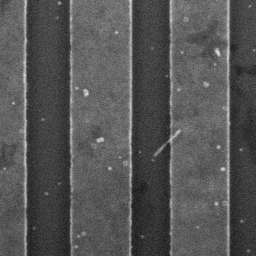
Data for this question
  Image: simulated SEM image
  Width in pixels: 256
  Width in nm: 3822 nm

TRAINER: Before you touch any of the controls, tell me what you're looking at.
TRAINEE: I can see lines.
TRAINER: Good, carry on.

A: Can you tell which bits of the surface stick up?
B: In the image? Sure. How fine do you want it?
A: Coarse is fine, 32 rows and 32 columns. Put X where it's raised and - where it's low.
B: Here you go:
XXX------XXXXXXX-----XXXXXXXX---
XXX------XXXXXXX-----XXXXXXXX---
XXX------XXXXXXX-----XXXXXXXX---
XXX------XXXXXXX-----XXXXXXXX---
XXX------XXXXXXX-----XXXXXXXX---
XXX------XXXXXXX-----XXXXXXXX---
XXX------XXXXXXX-----XXXXXXXX---
XXX------XXXXXXX-----XXXXXXXX---
XXX------XXXXXXX-----XXXXXXXX---
XXX------XXXXXXX-----XXXXXXXX---
XXX------XXXXXXX-----XXXXXXXX---
XXX------XXXXXXX-----XXXXXXXX---
XXX------XXXXXXX-----XXXXXXXX---
XXX------XXXXXXX-----XXXXXXXX---
XXX------XXXXXXX-----XXXXXXXX---
XXX------XXXXXXX-----XXXXXXXX---
XXX------XXXXXXX-----XXXXXXXX---
XXX------XXXXXXX-----XXXXXXXX---
XXX------XXXXXXX-----XXXXXXXX---
XXX------XXXXXXX-----XXXXXXXX---
XXX------XXXXXXX-----XXXXXXXX---
XXX------XXXXXXX-----XXXXXXXX---
XXX------XXXXXXX-----XXXXXXXX---
XXX------XXXXXXX-----XXXXXXXX---
XXX------XXXXXXX-----XXXXXXXX---
XXX------XXXXXXX-----XXXXXXXX---
XXX------XXXXXXX-----XXXXXXXX---
XXX------XXXXXXX-----XXXXXXXX---
XXX------XXXXXXX-----XXXXXXXX---
XXX------XXXXXXX-----XXXXXXXX---
XXX------XXXXXXX-----XXXXXXXX---
XXX------XXXXXXX-----XXXXXXXX---